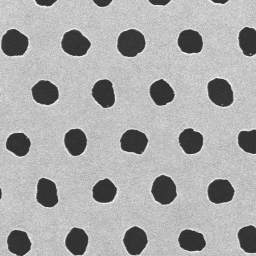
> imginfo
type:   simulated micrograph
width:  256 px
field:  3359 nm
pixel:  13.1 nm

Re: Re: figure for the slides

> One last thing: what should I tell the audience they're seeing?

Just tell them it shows a regular array of holes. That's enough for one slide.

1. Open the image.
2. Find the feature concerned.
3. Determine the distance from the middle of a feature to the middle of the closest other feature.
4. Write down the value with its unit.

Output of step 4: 741 nm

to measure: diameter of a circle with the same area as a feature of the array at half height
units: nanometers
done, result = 338